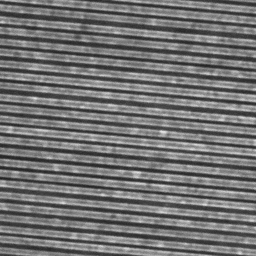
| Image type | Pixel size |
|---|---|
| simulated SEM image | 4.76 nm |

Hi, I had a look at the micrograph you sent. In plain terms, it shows parallel lines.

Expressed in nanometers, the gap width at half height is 22.5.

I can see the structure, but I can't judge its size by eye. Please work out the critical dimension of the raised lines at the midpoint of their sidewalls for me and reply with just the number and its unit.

26.6 nm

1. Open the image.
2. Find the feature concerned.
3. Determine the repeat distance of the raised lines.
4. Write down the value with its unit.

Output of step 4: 52.1 nanometers